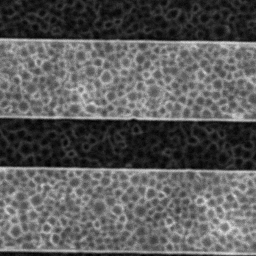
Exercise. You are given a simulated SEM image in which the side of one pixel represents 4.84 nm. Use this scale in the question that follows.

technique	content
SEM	one or a few lines or trenches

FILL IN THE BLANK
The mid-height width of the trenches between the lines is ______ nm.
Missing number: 249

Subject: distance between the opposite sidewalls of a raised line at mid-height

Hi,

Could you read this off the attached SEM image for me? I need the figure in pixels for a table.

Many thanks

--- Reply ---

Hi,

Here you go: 80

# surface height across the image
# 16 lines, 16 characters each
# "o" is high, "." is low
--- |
................
................
o...............
oooooooooooooooo
oooooooooooooooo
oooooooooooooooo
oooooooooooooooo
................
................
................
................
oooooooooooooooo
oooooooooooooooo
oooooooooooooooo
oooooooooooooooo
oooooooooooooooo